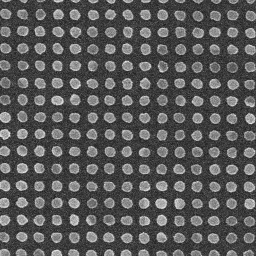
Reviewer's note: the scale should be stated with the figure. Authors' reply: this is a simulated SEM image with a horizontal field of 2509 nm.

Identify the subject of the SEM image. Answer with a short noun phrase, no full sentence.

a regular array of raised bodies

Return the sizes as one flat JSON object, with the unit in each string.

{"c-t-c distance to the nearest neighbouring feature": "0.165 um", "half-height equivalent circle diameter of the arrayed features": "0.0989 µm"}